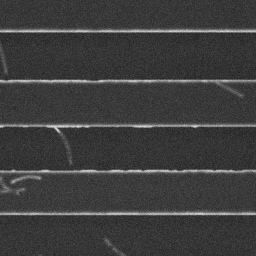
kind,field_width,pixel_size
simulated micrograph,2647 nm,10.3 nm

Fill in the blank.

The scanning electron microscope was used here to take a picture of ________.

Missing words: lines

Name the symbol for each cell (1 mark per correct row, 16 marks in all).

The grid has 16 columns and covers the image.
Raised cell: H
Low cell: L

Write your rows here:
HHHHHHHHHHHHHHHH
HHHHHHHHHHHHHHHH
LLLLLLLLLLLLLLLL
LLLLLLLLLLLLLLLL
LLLLLLLLLLLLLLLL
HHHHHHHHHHHHHHHH
HHHHHHHHHHHHHHHH
HHHHHHHHHHHHHHHH
LLLLLLLLLLLLLLLL
LLLLLLLLLLLLLLLL
LLLLLLLLLLLLLLLL
HHHHHHHHHHHHHHHH
HHHHHHHHHHHHHHHH
LLLLLLLLLLLLLLLL
LLLLLLLLLLLLLLLL
LLLLLLLLLLLLLLLL